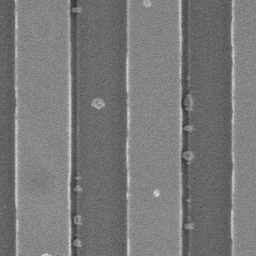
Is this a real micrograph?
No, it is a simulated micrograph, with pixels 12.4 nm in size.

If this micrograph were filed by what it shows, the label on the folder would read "lines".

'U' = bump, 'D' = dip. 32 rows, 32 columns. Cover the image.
DDUUUUUUUDDDDDDDUUUUUUUDDDDDDUUU
DDUUUUUUUDDDDDDDUUUUUUUDDDDDDUUU
DDUUUUUUUDDDDDDDUUUUUUUDDDDDDUUU
DDUUUUUUUDDDDDDDUUUUUUUDDDDDDUUU
DDUUUUUUUDDDDDDDUUUUUUUDDDDDDUUU
DDUUUUUUUDDDDDDDUUUUUUUDDDDDDUUU
DDUUUUUUUDDDDDDDUUUUUUUDDDDDDUUU
DDUUUUUUUDDDDDDDUUUUUUUDDDDDDUUU
DDUUUUUUUDDDDDDDUUUUUUUDDDDDDUUU
DDUUUUUUUDDDDDDDUUUUUUUDDDDDDUUU
DDUUUUUUUDDDDDDDUUUUUUUDDDDDDUUU
DDUUUUUUUDDDDDDDUUUUUUUDDDDDDUUU
DDUUUUUUUDDDDDDDUUUUUUUDDDDDDUUU
DDUUUUUUUDDDDDDDUUUUUUUDDDDDDUUU
DDUUUUUUUDDDDDDDUUUUUUUDDDDDDUUU
DDUUUUUUUDDDDDDDUUUUUUUDDDDDDUUU
DDUUUUUUUDDDDDDDUUUUUUUDDDDDDUUU
DDUUUUUUUDDDDDDDUUUUUUUDDDDDDUUU
DDUUUUUUUDDDDDDDUUUUUUUDDDDDDUUU
DDUUUUUUUDDDDDDDUUUUUUUDDDDDDUUU
DDUUUUUUUDDDDDDDUUUUUUUDDDDDDUUU
DDUUUUUUUDDDDDDDUUUUUUUDDDDDDUUU
DDUUUUUUUDDDDDDDUUUUUUUDDDDDDUUU
DDUUUUUUUDDDDDDDUUUUUUUDDDDDDUUU
DDUUUUUUUDDDDDDDUUUUUUUDDDDDDUUU
DDUUUUUUUDDDDDDDUUUUUUUDDDDDDUUU
DDUUUUUUUDDDDDDDUUUUUUUDDDDDDUUU
DDUUUUUUUDDDDDDDUUUUUUUDDDDDDUUU
DDUUUUUUUDDDDDDDUUUUUUUDDDDDDUUU
DDUUUUUUUDDDDDDDUUUUUUUDDDDDDUUU
DDUUUUUUUDDDDDDDUUUUUUUDDDDDDUUU
DDUUUUUUUDDDDDDDUUUUUUUDDDDDDUUU